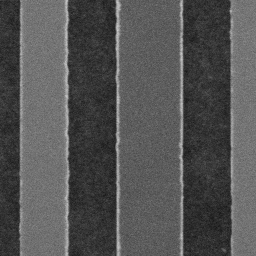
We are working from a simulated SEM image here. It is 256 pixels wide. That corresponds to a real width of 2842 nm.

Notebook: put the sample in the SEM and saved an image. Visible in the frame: lines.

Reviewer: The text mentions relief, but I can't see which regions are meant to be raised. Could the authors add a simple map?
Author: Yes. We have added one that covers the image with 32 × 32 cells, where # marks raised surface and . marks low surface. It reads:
...#####.......########......###
...######......########......###
...######......########......###
...#####.......########......###
...#####.......########......###
...#####.......########......###
...#####.......########......###
...#####.......########......###
...#####.......########......###
...######......########......###
...######......########......###
...#####.......########......###
...#####.......########......###
...#####.......########......###
...######......########......###
...######......########......###
...#####.......########......###
...######......########......###
...######......########......###
...#####.......########......###
...######......########......###
...######......########......###
...######......########......###
...######......########......###
...######......########......###
..#######......########......###
...######......########......###
...#####.......########......###
..#######......########......###
...######......########......###
...######......########......###
...######......########......###